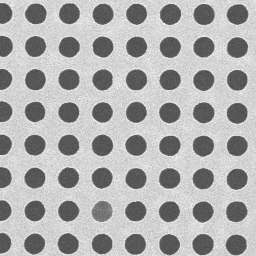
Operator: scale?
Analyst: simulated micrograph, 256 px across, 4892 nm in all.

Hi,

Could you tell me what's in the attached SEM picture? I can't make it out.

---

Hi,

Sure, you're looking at a regular array of holes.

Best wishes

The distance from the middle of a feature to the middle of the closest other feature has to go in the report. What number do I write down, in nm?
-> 624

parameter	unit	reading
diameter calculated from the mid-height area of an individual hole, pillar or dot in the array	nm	400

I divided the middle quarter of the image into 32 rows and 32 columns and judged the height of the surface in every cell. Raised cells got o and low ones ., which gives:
oooooooooooooooooooooooooooooooo
..ooooooo..oooooo..ooooooo.ooooo
...ooooo....oooo....oooo.....ooo
....ooo.....oooo.....ooo.....ooo
....ooo.....oooo.....ooo.....ooo
...ooooo....oooo....oooo.....ooo
..ooooooo..oooooo..ooooooo.ooooo
oooooooooooooooooooooooooooooooo
oooooooooooooooooooooooooooooooo
oooooooooooooooooo.ooooooooooooo
...ooooo....oooo....oooo....oooo
....ooo.....oooo.....ooo.....ooo
....ooo.....ooo......ooo.....ooo
...oooo.....oooo....oooo.....ooo
...oooooo..oooooo..oooooo...oooo
oooooooooooooooooooooooooooooooo
oooooooooooooooooooooooooooooooo
oooooooooooooooooooooooooooooooo
...ooooo...ooooo....ooooo...oooo
....ooo.....ooo.....oooo.....ooo
....ooo.....ooo......ooo.....ooo
....ooo.....oooo....oooo.....ooo
...ooooo...oooooo...ooooo...oooo
oooooooooooooooooooooooooooooooo
oooooooooooooooooooooooooooooooo
oooooooooooooooooooooooooooooooo
...ooooo...oooooo...ooooo...oooo
....ooo.....oooo....oooo.....ooo
....ooo.....ooo......ooo.....ooo
...oooo.....ooo......ooo.....ooo
...ooooo...ooooo....ooooo...oooo
oooooooooooooooooooooooooooooooo